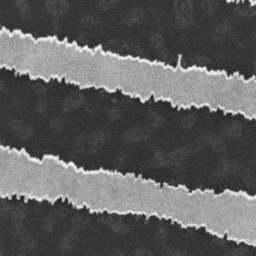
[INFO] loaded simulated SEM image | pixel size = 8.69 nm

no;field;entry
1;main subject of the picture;one or a few lines or trenches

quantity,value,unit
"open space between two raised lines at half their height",0.701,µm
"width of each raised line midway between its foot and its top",322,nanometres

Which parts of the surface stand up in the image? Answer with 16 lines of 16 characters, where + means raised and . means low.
................
................
+++.............
+++++++.........
.++++++++++++...
......++++++++++
...........+++++
................
................
+...............
+++++...........
++++++++++......
....++++++++++++
..........++++++
.............+++
................